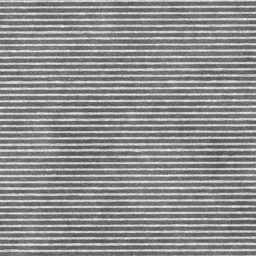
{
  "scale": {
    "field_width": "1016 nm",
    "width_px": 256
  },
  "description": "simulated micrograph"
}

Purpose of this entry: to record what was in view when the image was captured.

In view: parallel lines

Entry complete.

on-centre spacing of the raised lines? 24.8 nanometres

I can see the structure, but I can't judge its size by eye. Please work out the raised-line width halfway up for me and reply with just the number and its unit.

6 nm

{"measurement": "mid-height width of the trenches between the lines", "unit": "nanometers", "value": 18.9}